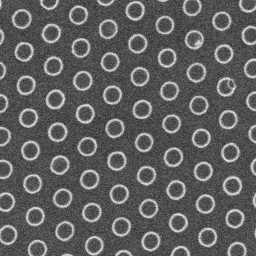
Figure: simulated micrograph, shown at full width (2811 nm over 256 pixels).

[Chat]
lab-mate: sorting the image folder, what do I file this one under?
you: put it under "a regular array of raised bodies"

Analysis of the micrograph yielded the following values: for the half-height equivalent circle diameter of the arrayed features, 194 nanometers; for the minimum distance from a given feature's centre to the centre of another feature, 358 nanometres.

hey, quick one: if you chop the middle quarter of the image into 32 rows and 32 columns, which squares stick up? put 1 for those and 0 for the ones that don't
00000000001110000000000001100000
00000000001100000011000000000001
00011100000000000111100000000001
00011110000000000111100000000001
00011110000000000111100000000000
00011100000000000000000001110000
00000000001111000000000011110000
00000000001111000000000011110000
00000000001111000000000001110000
00000000000110000001100000000000
00001100000000000011110000000000
00011110000000000111110000000000
00011110000000000011100000000000
00011110000000000000000001110000
00000100000111000000000001111000
00000000000111100000000001111000
00000000000111100000000001110000
10000000000111000000100000000000
00000000000000000011110000000000
00001111000000000011110000000000
00001111000000000011110000000000
00001111000000000001100000111000
00000110000011100000000000111000
00000000000111100000000001111000
10000000000111100000000001111000
10000000000111100000000000000000
10000000000000000001110000000000
00000111000000000011111000000000
00001111000000000001111000000000
00001111000000000001110000011000
00000111000001100000000000111100
00000000000011110000000000111100